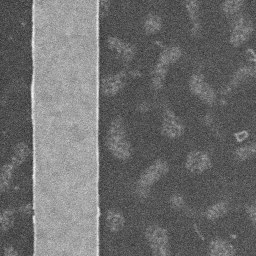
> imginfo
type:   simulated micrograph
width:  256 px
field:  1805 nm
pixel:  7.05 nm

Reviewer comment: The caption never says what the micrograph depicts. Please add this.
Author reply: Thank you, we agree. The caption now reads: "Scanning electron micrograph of one or a few lines or trenches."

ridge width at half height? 454 nm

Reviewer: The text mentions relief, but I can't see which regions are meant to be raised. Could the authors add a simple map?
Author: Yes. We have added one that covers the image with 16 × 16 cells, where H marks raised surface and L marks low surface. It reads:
LLHHHHLLLLLLLLLL
LLHHHHLLLLLLLLLL
LLHHHHLLLLLLLLLL
LLHHHHLLLLLLLLLL
LLHHHHLLLLLLLLLL
LLHHHHLLLLLLLLLL
LLHHHHLLLLLLLLLL
LLHHHHLLLLLLLLLL
LLHHHHLLLLLLLLLL
LLHHHHLLLLLLLLLL
LLHHHHLLLLLLLLLL
LLHHHHLLLLLLLLLL
LLHHHHLLLLLLLLLL
LLHHHHLLLLLLLLLL
LLHHHHLLLLLLLLLL
LLHHHHLLLLLLLLLL